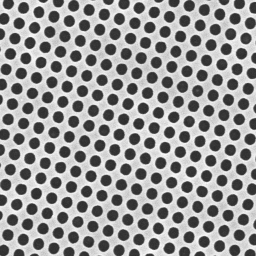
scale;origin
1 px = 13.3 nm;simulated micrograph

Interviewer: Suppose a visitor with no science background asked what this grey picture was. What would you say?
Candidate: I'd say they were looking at a regular array of holes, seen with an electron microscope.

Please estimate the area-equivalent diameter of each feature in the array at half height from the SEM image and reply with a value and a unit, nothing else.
161 nm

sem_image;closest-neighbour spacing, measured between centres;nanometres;209